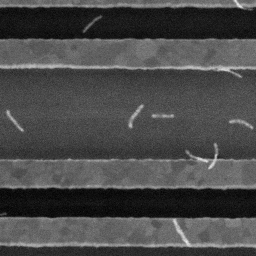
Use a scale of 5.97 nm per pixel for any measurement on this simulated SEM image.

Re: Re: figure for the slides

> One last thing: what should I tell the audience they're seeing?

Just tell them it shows lines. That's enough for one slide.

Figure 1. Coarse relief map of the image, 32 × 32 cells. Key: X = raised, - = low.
XXXXXXXXXXXXXXXXXXXXXXXXXXXXXXXX
--------------------------------
--------------------------------
--------------------------------
--------------------------------
XXXXXXXXXXXXXXXXXXXXXXXXXXXXXXXX
XXXXXXXXXXXXXXXXXXXXXXXXXXXXXXXX
XXXXXXXXXXXXXXXXXXXXXXXXXXXXXXXX
XX-X-X---XXXXXXXXXXXXXXXXXXXXXXX
--------------------------------
--------------------------------
--------------------------------
--------------------------------
--------------------------------
--------------------------------
--------------------------------
--------------------------------
--------------------------------
--------------------------------
--------------------------------
XXXXXXXXXXXXXXXXXXXXXXXXXXXXXXXX
XXXXXXXXXXXXXXXXXXXXXXXXXXXXXXXX
XXXXXXXXXXXXXXXXXXXXXXXXXXXXXXXX
-X-X----------XXXX-X-X--XXXXXXXX
--------------------------------
--------------------------------
--------------------------------
XXXXXXXXXXXXXXXXXXXXXXXXXXXXXXXX
XXXXXXXXXXXXXXXXXXXXXXXXXXXXXXXX
XXXXXXXXXXXXXXXXXXXXXXXXXXXXXXXX
XXXXXXXXXXXXXXXXXXXXXXXXXXXXXXXX
--------------------------------